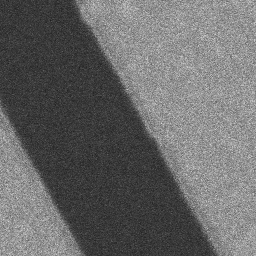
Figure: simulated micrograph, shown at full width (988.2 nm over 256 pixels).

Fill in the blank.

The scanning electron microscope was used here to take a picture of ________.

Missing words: one or a few lines or trenches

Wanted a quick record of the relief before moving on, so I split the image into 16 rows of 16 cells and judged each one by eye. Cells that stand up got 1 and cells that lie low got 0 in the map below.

1111100000000000
1111110000000000
1111110000000000
1111111000000000
1111111100000000
1111111100000000
1111111110000000
1111111110000000
0111111111000000
0111111111000000
0011111111100000
0011111111100000
0001111111110000
0000111111110000
0000111111111000
0000011111111100